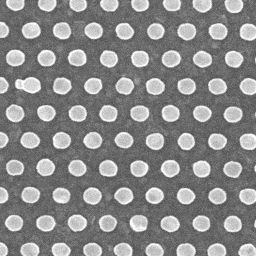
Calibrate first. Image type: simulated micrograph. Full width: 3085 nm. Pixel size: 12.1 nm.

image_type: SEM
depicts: a regular array of raised bodies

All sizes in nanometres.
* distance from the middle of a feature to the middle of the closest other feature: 373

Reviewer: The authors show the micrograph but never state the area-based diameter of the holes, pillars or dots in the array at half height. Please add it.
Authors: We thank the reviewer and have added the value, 198 nanometers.